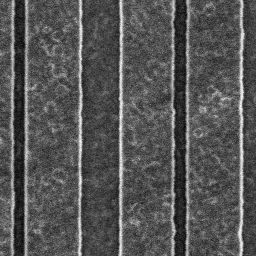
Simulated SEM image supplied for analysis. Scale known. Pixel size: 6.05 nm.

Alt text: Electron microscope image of one or a few lines or trenches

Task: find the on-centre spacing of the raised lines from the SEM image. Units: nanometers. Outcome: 488